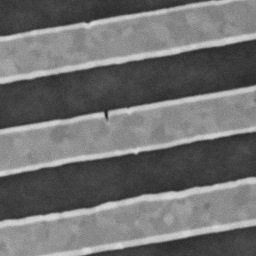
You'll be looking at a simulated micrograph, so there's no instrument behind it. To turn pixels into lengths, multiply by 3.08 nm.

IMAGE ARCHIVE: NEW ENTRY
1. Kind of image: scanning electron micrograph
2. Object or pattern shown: one or a few lines or trenches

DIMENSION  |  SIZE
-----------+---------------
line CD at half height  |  0.127 microns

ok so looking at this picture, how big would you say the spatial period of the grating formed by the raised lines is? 91.6 px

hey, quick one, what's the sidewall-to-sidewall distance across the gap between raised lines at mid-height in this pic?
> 0.156 micrometres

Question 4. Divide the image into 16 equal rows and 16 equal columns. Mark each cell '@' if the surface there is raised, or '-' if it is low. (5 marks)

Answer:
-----------@@@@@
------@@@@@@@@@@
@@@@@@@@@@@@@@@-
@@@@@@@@@-------
@@@-------------
----------------
----------@@@@@@
-----@@@@@@@@@@@
@@@@@@@@@@@@@---
@@@@@@@@--------
@@--------------
---------------@
--------@@@@@@@@
----@@@@@@@@@@@@
@@@@@@@@@@@@----
@@@@@@@---------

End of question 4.